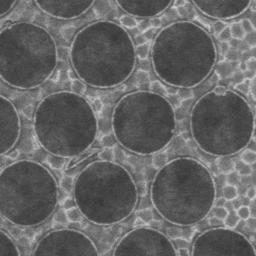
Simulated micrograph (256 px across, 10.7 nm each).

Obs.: raised bodies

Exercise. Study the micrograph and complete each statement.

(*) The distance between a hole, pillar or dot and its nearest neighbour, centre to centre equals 834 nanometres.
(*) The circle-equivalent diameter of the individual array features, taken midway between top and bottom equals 707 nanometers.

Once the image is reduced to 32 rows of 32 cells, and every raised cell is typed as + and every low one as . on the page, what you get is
++...+++++++...++++++...+++++++.
+.....+++++.....++++.....+++++..
................................
.++++.....+++++......++++.......
++++++...+++++++....++++++......
+++++++..++++++++..++++++++.....
+++++++..++++++++..++++++++.....
+++++++..++++++++..++++++++.....
+++++++..++++++++..++++++++.....
++++++....++++++....++++++......
.++++......++++......++++.....++
.......++........++.......+++.++
+....++++++....++++++....++++++.
++...+++++++..++++++++..+++++++.
++..++++++++..++++++++..++++++++
++..++++++++..++++++++..++++++++
++..++++++++..++++++++..++++++++
++...+++++++...++++++...+++++++.
+....++++++.....++++.....++++++.
.......++++.....................
.++++...++.++++......++++.......
++++++....++++++....++++++......
+++++++..++++++++..++++++++.....
+++++++..++++++++..++++++++.....
+++++++..++++++++..++++++++.....
+++++++...+++++++..++++++++.....
+++++++...++++++....++++++......
.+++++.....++++......++++.......
.................++.............
+.....+++++.....+++++....+++++..
++...+++++++...+++++++..+++++++.
++..++++++++..++++++++..++++++++